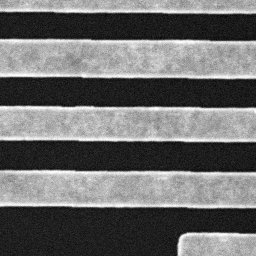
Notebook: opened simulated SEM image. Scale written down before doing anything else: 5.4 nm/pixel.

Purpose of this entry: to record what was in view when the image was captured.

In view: wiring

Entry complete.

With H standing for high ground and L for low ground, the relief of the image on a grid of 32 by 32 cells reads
HHHHHHHHHHHHHHHHHHHHHHHHHHHHHHHH
LLLLLLLLLLLLLLLLLLLLLLLLLLLLLLLL
LLLLLLLLLLLLLLLLLLLLLLLLLLLLLLLL
LLLLLLLLLLLLLLLLLLLLLLLLLLLLLLLL
LLLLLLLLLLLLLLLLLLLLLLLLLLLLLLLL
HHHHHHHHHHHHHHHHHHHHHHHHHHHHHHHH
HHHHHHHHHHHHHHHHHHHHHHHHHHHHHHHH
HHHHHHHHHHHHHHHHHHHHHHHHHHHHHHHH
HHHHHHHHHHHHHHHHHHHHHHHHHHHHHHHH
LLLLLLLLLLLLLLLLLLHHHHHHHHHHHHHH
LLLLLLLLLLLLLLLLLLLLLLLLLLLLLLLL
LLLLLLLLLLLLLLLLLLLLLLLLLLLLLLLL
LLLLLLLLLLLLLLLLLLLLLLLLLLLLLLLL
HHHLLLLLLLLLLLLLLLLLLLLLLLLLLLLL
HHHHHHHHHHHHHHHHHHHHHHHHHHHHHHHH
HHHHHHHHHHHHHHHHHHHHHHHHHHHHHHHH
HHHHHHHHHHHHHHHHHHHHHHHHHHHHHHHH
LLLLLLLLLLLLLLLLLLLLLLLLLLLLLLLL
LLLLLLLLLLLLLLLLLLLLLLLLLLLLLLLL
LLLLLLLLLLLLLLLLLLLLLLLLLLLLLLLL
LLLLLLLLLLLLLLLLLLLLLLLLLLLLLLLL
LLLLLLLLLLLLLLLLLLLLLLLLLLLLLLLL
HHHHHHHHHHHHHHHHHHHHHHHHHHHHHHHH
HHHHHHHHHHHHHHHHHHHHHHHHHHHHHHHH
HHHHHHHHHHHHHHHHHHHHHHHHHHHHHHHH
LLHHHHHHHHHHHHHHHHHHHHHHHHHHHHHH
LLLLLLLLLLLLLLLLLLLLLLLLLLLLLLLL
LLLLLLLLLLLLLLLLLLLLLLLLLLLLLLLL
LLLLLLLLLLLLLLLLLLLLLLLLLLLLLLLL
LLLLLLLLLLLLLLLLLLLLLLLHHHHHHHHH
LLLLLLLLLLLLLLLLLLLLLLLHHHHHHHHH
LLLLLLLLLLLLLLLLLLLLLLHHHHHHHHHH